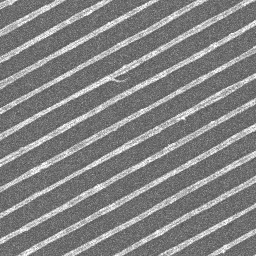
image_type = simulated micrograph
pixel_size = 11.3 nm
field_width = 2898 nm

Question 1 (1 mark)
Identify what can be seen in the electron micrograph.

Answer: parallel lines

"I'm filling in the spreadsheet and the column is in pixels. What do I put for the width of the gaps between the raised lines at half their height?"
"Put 18.5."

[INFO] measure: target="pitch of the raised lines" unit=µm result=0.258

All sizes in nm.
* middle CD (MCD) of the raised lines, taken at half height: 44.7